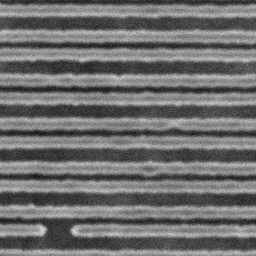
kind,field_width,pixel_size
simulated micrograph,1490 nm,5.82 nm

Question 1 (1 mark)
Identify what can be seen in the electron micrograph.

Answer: parallel lines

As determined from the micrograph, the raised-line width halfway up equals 10.4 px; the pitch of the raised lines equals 0.128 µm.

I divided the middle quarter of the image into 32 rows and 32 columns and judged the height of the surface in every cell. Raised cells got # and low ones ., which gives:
................................
................................
................................
################################
################################
.........................###..##
................................
##################.####.########
################################
################################
................................
................................
................................
................................
################################
################################
............###...............#.
................................
################################
################################
################################
................................
................................
................................
.....................#..........
################################
################################
....................###.........
................................
########.#######.##.###########.
################################
################################